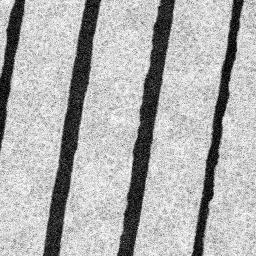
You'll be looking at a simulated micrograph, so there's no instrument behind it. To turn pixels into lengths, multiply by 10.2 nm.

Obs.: one or a few lines or trenches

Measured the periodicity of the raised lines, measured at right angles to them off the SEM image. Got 0.756 micrometres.